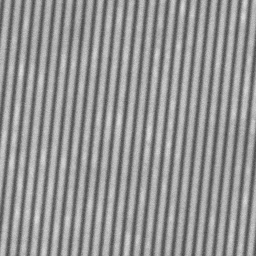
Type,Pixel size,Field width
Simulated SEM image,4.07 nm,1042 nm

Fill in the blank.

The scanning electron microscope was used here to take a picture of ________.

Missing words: parallel lines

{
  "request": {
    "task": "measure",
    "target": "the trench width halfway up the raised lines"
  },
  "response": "4.23 px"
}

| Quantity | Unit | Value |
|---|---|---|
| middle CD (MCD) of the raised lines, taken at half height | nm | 24.3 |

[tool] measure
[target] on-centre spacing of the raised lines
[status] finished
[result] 41.8 nm